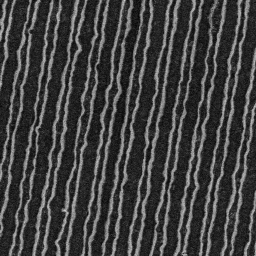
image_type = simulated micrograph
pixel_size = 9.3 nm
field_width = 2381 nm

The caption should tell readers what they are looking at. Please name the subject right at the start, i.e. parallel lines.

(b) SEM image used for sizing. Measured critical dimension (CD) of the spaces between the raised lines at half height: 141 nm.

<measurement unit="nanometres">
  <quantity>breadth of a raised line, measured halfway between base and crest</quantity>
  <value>78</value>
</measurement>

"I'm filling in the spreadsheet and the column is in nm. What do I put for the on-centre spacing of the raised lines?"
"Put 216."